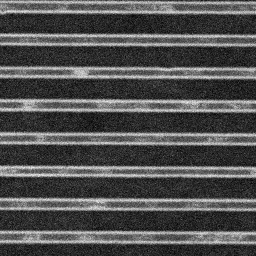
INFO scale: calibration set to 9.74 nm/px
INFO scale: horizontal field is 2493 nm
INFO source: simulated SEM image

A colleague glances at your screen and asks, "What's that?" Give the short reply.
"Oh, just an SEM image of parallel lines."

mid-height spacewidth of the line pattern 226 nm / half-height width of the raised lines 0.101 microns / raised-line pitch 0.32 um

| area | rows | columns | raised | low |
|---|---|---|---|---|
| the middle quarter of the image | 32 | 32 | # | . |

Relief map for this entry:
................................
################################
################################
................................
................................
................................
................................
................................
................................
################################
################################
.................###############
................................
................................
................................
................................
................................
................................
################################
################################
................................
................................
................................
................................
................................
................................
################################
################################
................................
................................
................................
................................